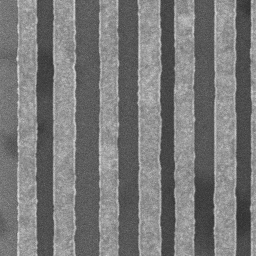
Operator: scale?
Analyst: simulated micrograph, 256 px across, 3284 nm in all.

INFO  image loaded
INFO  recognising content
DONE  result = lines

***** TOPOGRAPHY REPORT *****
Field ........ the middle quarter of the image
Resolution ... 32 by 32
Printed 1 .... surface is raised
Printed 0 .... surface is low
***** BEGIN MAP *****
11100000011111000001111100001111
11100000011110000001111100001111
11100000011110000001111100001111
11100000011110000001111100001111
11100000011110000001111100001111
11100000011110000001111100001111
11100000011110000001111100001111
11100000011110000001111100001111
11100000011111000001111100001111
11100000011111000001111100001111
11100000011110000001111100001111
11100000011110000001111100001111
11100000011110000001111100001111
11100000011110000001111100001111
11100000011111000001111100001111
11100000011111000001111100001111
11100000011110000001111100001111
11100000011110000001111100001111
11100000011110000001111100001111
11100000011110000001111100001111
11100000011110000001111100001111
11100000011110000001111100001111
11100000011110000001111100001111
11100000011110000001111100001111
11100000011110000001111100001111
11100000011110000001111100001111
11100000011110000001111100001111
11100000011110000001111100001111
11100000011110000001111100001111
11100000011111000001111100001111
11100000011111000001111100001111
11100000011110000001111100001111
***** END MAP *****